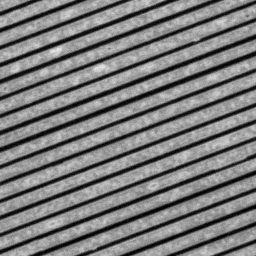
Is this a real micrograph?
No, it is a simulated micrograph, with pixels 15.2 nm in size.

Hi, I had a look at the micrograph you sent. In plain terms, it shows parallel lines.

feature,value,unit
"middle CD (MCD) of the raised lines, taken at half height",153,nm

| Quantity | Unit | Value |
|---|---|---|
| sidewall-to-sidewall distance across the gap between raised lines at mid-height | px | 5.49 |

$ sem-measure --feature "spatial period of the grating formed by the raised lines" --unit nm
243